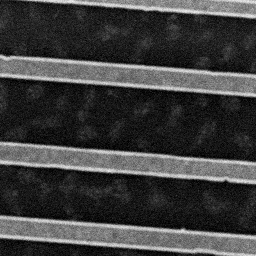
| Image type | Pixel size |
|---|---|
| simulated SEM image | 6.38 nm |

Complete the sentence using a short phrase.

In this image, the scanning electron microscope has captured one or a few lines or trenches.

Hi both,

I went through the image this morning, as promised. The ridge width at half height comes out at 122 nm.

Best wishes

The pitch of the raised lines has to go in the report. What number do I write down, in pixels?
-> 80.3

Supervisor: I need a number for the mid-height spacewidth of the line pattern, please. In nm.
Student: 381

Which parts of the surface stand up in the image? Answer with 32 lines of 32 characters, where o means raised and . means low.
.............ooooooooooooooooooo
..........................oooooo
................................
................................
................................
................................
................................
oooooo..........................
ooooooooooooooooooo.............
..ooooooooooooooooooooooooooooo.
..............oooooooooooooooooo
...........................ooooo
................................
................................
................................
................................
................................
................................
ooooooo.........................
oooooooooooooooooooo............
...ooooooooooooooooooooooooooooo
.................ooooooooooooooo
.............................ooo
................................
................................
................................
................................
oooo............................
ooooooooooooooooo...............
oooooooooooooooooooooooooooo....
.............ooooooooooooooooooo
..........................oooooo